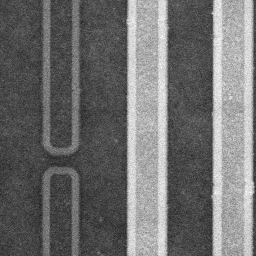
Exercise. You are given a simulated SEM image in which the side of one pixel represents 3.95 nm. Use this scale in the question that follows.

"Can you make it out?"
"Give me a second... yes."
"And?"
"one or a few lines or trenches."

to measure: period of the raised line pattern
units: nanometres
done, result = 339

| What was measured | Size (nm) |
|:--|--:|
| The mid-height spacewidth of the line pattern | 220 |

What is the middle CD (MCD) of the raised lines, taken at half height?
118 nm